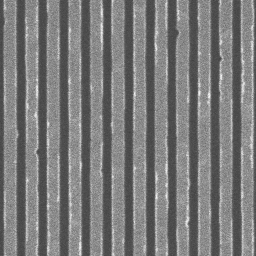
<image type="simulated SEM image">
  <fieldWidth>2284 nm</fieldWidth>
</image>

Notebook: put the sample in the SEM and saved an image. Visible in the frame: parallel lines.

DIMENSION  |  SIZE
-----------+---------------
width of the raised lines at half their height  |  122 nanometres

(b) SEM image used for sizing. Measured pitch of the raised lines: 0.192 µm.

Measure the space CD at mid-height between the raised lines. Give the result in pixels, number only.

8.13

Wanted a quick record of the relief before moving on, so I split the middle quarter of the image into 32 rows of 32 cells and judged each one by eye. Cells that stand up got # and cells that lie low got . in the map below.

.###...###..###..###...###..###.
.###...###..###..###...###..###.
.###...###..###..###...###..###.
.###...###..###..###...###..###.
.###...###..###..###...###..###.
.###...###..###..###...###..###.
.###...###..###..###...###..###.
.###...###..###..###...###..###.
.###...###..###..###...###..###.
.###...###..###..###...###..###.
.###...###..###..###...###..###.
.###...###..###..###...###..###.
.###...###..###..###...###..###.
.###...###..###..###...###..###.
.###...###..###..####..###..###.
.###...###..###..####..###..###.
.###...###..###..###...###..###.
.###...###..###..###...###..###.
.###...###..###..###...###..###.
.###...###..###..###...###..###.
.###...###..###..###...###..###.
.###...###..###..###...###..###.
.###...###..###..###...###..###.
.###...###..###..###...###..###.
.###...###..###..###...###..###.
.###...###..###..###...###..###.
.###...###..###..###...###..###.
.###..####..###..####..###..###.
.###..####..###..####..###..###.
.###..####..###..####..###..###.
.###..####..###..####..###..###.
.###...###..###..####..###..###.